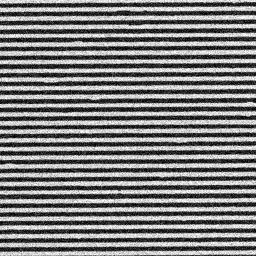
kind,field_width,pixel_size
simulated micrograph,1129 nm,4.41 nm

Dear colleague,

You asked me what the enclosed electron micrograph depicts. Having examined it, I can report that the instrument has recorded parallel lines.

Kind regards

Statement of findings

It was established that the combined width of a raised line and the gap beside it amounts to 0.0385 microns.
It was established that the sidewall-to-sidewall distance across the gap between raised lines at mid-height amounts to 19.9 nanometers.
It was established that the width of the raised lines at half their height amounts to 16 nm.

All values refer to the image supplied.